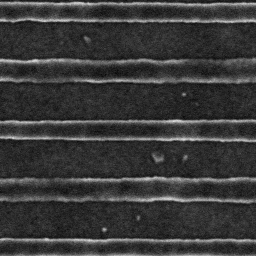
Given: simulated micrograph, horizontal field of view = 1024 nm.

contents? lines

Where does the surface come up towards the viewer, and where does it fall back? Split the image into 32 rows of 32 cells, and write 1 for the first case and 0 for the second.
11111111111111111111111000111111
11111111111111111111111111111111
11101111111111111111111111111111
00000000000000000000000000000000
00000000000000000000000000000000
00000000000000000000000000000000
00000000000000000000000000000000
10000011100000000110000000000000
11111111111111111111111111111111
11111111111111111111111111111111
00000000000000000000000000000000
00000000000000000000000000000000
00000000000000000000000000000000
00000000000000000000000000000000
00000000000000000000000000000000
11111111111111111111111111111111
11111111111111111111111111111111
00000000000000000000110000111111
00000000000000000000000000000000
00000000000000000000000000000000
00000000000000000000000000000000
00000000000000000000000000000000
00010000011111111111111111111111
11111111111111111111111111111111
11111111111111111111111111111111
00000000000000000000000000000000
00000000000000000000000000000000
00000000000000000000000000000000
00000000000000000000000000000000
00000000000000000000000000000000
11111111111111111111111111111111
11111111111111111111111111111111